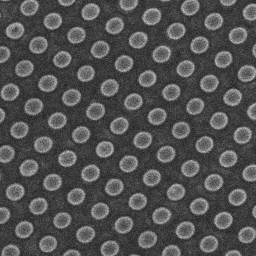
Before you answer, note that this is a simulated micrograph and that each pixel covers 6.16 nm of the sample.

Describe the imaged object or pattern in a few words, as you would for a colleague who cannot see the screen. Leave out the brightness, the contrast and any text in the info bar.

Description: a regular array of raised bodies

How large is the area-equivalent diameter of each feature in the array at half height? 0.0997 um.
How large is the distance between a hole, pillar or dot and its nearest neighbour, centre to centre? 168 nm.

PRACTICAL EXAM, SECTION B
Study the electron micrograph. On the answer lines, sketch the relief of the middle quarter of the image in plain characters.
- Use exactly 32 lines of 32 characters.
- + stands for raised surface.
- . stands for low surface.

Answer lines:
.............++++............+++
....+++.......++............++++
....+++.............+++......+++
....+++............++++.........
..........+++......++++.........
.........++++.......+.....++....
..+......++++............++++...
++++......++.............++++...
++++............+++......+++....
+++............++++............+
.......++......++++............+
......++++............+++......+
......++++...........++++.......
.......++............++++.......
............++++......+++.......
............++++............+++.
...+++......+++............++++.
..++++.............++......++++.
..++++............++++..........
...++.............++++..........
.........+++......+++...........
........++++............+++.....
+++......+++............++++....
+++............+++......+++.....
+++...........++++.............+
......++......++++............++
.....++++......++.............++
.....++++...........++++......++
.....+++............++++........
...........+++......++++........
...........++++............++...
..++.......+++............++++..